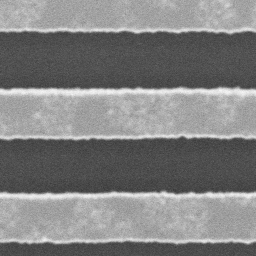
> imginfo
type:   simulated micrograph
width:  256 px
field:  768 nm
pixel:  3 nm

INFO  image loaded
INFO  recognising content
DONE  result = lines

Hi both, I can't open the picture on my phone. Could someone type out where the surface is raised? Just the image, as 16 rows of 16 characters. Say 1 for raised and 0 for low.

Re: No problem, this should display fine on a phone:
1111111111111111
1111111111111111
0000000000000000
0000000000000000
0000000000000000
0000000000000000
1111111111111111
1111111111111111
1111111111111111
0000000000000000
0000000000000000
0000000000000000
1111111111111111
1111111111111111
1111111111111111
0000000000000000